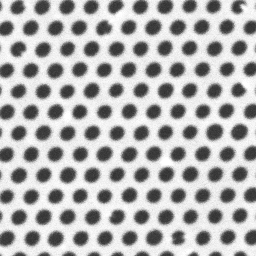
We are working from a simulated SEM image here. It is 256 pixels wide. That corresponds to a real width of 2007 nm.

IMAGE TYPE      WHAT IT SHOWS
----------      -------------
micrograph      a regular array of holes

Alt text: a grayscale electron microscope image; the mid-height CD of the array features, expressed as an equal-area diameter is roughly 0.129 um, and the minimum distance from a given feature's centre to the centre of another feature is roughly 187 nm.